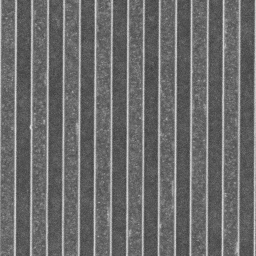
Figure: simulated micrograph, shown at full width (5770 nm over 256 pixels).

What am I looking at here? parallel lines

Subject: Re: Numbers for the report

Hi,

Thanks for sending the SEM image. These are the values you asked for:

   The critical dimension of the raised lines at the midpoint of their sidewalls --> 372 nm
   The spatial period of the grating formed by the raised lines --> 720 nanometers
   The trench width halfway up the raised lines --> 349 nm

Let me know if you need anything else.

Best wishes